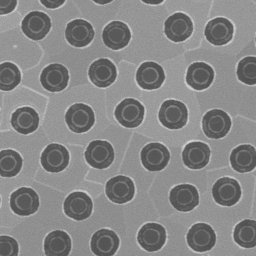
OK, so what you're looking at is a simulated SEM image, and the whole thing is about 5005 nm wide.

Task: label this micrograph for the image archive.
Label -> a regular array of ring-shaped grooves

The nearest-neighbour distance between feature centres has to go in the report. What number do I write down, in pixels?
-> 42.2